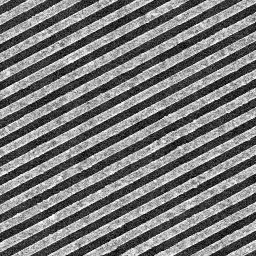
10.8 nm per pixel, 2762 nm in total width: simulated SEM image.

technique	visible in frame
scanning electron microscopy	parallel lines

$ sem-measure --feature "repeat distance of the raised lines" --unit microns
0.181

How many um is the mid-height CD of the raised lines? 0.0858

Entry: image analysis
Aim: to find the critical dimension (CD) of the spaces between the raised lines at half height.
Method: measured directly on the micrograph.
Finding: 94.1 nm